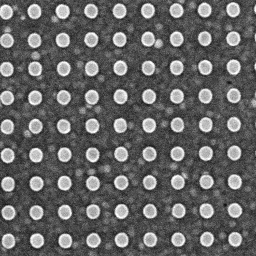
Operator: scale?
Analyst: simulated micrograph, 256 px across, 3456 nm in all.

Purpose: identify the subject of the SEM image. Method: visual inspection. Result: a regular array of raised bodies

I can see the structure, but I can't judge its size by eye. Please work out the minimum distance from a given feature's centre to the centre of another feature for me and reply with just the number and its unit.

381 nm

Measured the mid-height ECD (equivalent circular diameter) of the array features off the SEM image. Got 13.2 px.